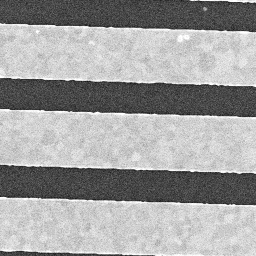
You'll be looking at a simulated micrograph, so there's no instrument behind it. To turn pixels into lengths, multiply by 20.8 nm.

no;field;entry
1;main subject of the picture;lines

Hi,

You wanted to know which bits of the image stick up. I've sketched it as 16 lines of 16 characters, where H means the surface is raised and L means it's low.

LLLLLLLLLLLLLLLL
HLLLLLLLLLLLLLLL
HHHHHHHHHHHHHHHH
HHHHHHHHHHHHHHHH
HHHHHHHHHHHHHHHH
LLLLLLLLLLLLLLLL
LLLLLLLLLLLLLLLL
HHHHHHHHHHHHHHHH
HHHHHHHHHHHHHHHH
HHHHHHHHHHHHHHHH
LLLLLLLHHHHHHHHH
LLLLLLLLLLLLLLLL
HHHHHLLLLLLLLLLL
HHHHHHHHHHHHHHHH
HHHHHHHHHHHHHHHH
HHHHHHHHHHHHHHHH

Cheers